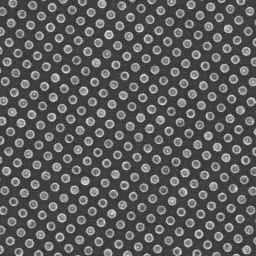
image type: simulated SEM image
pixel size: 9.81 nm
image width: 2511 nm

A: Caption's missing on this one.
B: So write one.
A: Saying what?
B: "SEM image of a regular array of raised bodies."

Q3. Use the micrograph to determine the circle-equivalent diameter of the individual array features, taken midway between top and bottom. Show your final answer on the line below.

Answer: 0.0791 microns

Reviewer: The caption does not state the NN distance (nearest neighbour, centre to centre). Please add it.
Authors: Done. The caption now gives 134 nanometres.